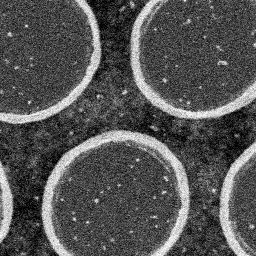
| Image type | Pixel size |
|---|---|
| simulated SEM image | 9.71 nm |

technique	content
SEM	raised bodies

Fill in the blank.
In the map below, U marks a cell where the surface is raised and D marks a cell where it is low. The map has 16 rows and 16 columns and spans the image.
UUUUUDDDDUUUUUUU
UUUUUUDDDUUUUUUU
UUUUUUDDDUUUUUUU
UUUUUUDDUUUUUUUU
UUUUUUDDDUUUUUUU
UUUUUDDDDUUUUUUU
UUUUDDDDDDUUUUUD
DDDDDDDDDDDDDDDD
DDDDDDDDDDDDDDDD
DDDDDUUUUUDDDDDD
DDDDUUUUUUUDDDDU
DDDUUUUUUUUDDDUU
DDDUUUUUUUUUDDUU
DDDUUUUUUUUDDDUU
DDDUUUUUUUUDDDUU
DDDDUUUUUUDDDDDU